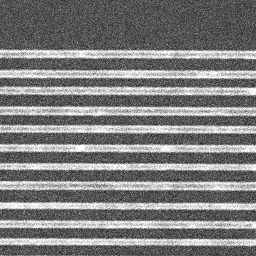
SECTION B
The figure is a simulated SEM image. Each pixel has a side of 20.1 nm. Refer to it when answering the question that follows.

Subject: parallel lines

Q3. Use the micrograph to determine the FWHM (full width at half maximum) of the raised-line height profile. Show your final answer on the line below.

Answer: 128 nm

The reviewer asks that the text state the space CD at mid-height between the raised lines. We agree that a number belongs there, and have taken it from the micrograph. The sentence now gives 12.9 pixels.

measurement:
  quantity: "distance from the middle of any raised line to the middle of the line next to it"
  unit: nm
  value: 378